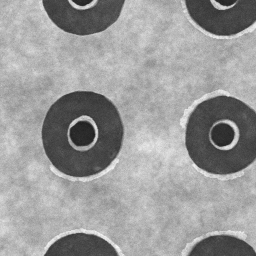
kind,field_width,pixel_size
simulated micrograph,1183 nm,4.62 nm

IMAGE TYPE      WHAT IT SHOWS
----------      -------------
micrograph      ring-shaped grooves with a dot in the middle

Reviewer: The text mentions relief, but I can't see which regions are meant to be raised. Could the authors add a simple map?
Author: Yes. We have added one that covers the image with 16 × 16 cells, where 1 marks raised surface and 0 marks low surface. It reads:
1110000011110000
1110000111110000
1111111111111111
1111111111111111
1111111111111111
1111111111111111
1110000111111001
1110000011110000
1110000011110000
1110000111110000
1111000111111001
1111111111111111
1111111111111111
1111111111111111
1111111111111111
1110000111110000